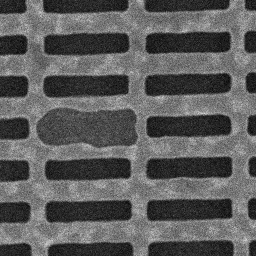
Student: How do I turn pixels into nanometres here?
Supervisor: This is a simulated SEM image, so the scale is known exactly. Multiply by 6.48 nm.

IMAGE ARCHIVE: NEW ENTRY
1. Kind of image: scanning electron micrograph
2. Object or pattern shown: a regular array of holes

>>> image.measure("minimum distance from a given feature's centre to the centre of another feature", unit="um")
0.271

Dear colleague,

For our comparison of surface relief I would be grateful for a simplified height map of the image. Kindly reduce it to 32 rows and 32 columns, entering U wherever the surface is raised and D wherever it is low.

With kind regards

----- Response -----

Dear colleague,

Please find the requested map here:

DDDUUDDDDDDDDDDDUUDDDDDDDDDDDUUD
DDDUUUDDDDDDDDUUUUUDDDUUUUUUUUUU
UUUUUUUUUUUUUUUUUUUUUUUUUUUUUUUU
UUUUUUUUUUUUUUUUUUUUUUUUUUUUUUUU
UDDUUUDDDDDDDDDDUUDDDDDDDDDDDUUD
DDDDUDDDDDDDDDDDUUDDDDDDDDDDDUDD
DDDUUUDDDDDDDDDDUUDDDDDDDDDDUUUD
UUUUUUUUUUUUUUUUUUUUUUUUUUUUUUUU
UUUUUUUUUUUUUUUUUUUUUUUUUUUUUUUU
DUUUUUDDDDDDDDDDUUDDDDDDDDDDDUUD
DDDDUDDDDDDDDDDDUUDDDDDDDDDDDUUD
DDDUUDDDDDDDDDDDUUDDDDDDDDDDUUUD
UUUUUUUUUUUUUUUUUUUUUUUUUUUUUUUU
UUUUUUUDDUUUUUUUUUUUUUUUUUUUUUUU
UUUUUDDDDDDDDDDDDUUDUUUDDDDDUUUD
DDDDUDDDDDDDDDDDDUDDDDDDDDDDDUUD
DDDDUDDDDDDDDDDDDUDDDDDDDDDDDUUD
UUUUUDDDDDDDDDDDDUUUUUUUUUUUUUUU
UUUUUUUUUUUUDUUUUUUUUUUUUUUUUUUU
UUUUUUUUUUUUUUUUUUUUUUUUUUUUUUUU
DDDDUUDDDDDDDDDDUUDDDDDDDDDDDUUD
DDDDUUDDDDDDDDDDUUDDDDDDDDDDDUUD
DDDUUUDDDDDDUUUUUUUUUUUUUUUUUUUU
UUUUUUUUUUUUUUUUUUUUUUUUUUUUUUUU
UUUUUUUUUUUUUUUUUUUUUUUUUUUUUUUU
DDDDUUDDDDDDDDDDUUDDDDDDDDDDDUUD
DDDDUUDDDDDDDDDDUUDDDDDDDDDDDUUD
DDDDUUDDDDDDDDDDUUUDDDDDDUUUUUUU
UUUUUUUUUUUUUUUUUUUUUUUUUUUUUUUU
UUUUUUUUUUUUUUUUUUUUUUUUUUUUUUUU
UUDUUUUDDDDDDDDDUUUDDDDDDDDDDUUD
DDDDUUDDDDDDDDDDDUDDDDDDDDDDDUUD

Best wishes